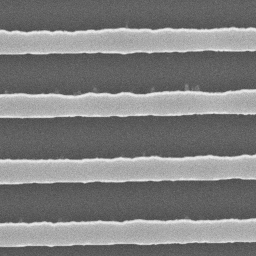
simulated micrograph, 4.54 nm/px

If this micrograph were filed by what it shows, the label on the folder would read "lines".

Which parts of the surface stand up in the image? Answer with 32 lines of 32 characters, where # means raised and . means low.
................................
................................
................................
................................
################################
################################
############.####.#.............
................................
................................
................................
................................
.....................####...####
################################
################################
################................
................................
................................
................................
................................
..............................##
################################
################################
####################............
................................
................................
................................
................................
............................##.#
################################
################################
###############..###............
................................